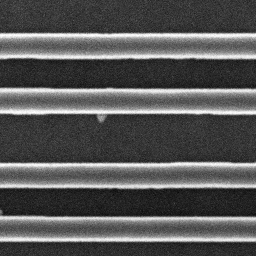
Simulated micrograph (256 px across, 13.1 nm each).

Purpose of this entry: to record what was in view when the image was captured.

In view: lines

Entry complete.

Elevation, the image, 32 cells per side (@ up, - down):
--------------------------------
--------------------------------
--------------------------------
--------------------------------
@@@@@@@@@@@@@@@@@@@@@@@@@@@@@@@@
@@@@@@@@@@@@@@@@@@@@@@@@@@@@@@@@
@@@@@@@@@@@@@@@@@@@@@@@@@@@@@@@@
--------------------------------
--------------------------------
--------------------------------
--------------------------------
@@@@@@@@@@@@@@@@@@@@@@@@@@@@@@@@
@@@@@@@@@@@@@@@@@@@@@@@@@@@@@@@@
@@@@@@@@@@@@@@@@@@@@@@@@@@@@@@@@
--------------------------------
--------------------------------
--------------------------------
--------------------------------
--------------------------------
--------------------------------
@@@@@@@@@@@@@@@@@@@@@@@@@@@@@@@@
@@@@@@@@@@@@@@@@@@@@@@@@@@@@@@@@
@@@@@@@@@@@@@@@@@@@@@@@@@@@@@@@@
--------------------------------
--------------------------------
--------------------------------
--------------------------------
@@@@@@@@@@@@@@@@@@@@@@@@@@@@@@@@
@@@@@@@@@@@@@@@@@@@@@@@@@@@@@@@@
@@@@@@@@@@@@@@@@@@@@@@@@@@@@@@@@
--------------------------------
--------------------------------